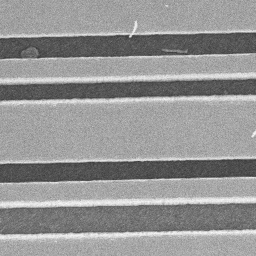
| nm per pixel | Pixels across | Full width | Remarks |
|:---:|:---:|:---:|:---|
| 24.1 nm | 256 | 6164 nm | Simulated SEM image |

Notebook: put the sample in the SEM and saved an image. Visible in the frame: lines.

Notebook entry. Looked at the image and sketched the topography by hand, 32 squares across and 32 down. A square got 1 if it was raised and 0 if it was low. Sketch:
11111111111111111111111111111111
11111111111111111111111111111111
11111111111111111111111111111111
11111111111111111111111111111111
11111111110000000000000000000000
00000000000000000000000000000000
00000000000000000000000000000000
11111111111111111111111111111111
11111111111111111111111111111111
11111111111111111111111111111111
00000000000000000000000000000000
00000000000000000000000000000000
00000001111111111111111111111111
11111111111111111111111111111111
11111111111111111111111111111111
11111111111111111111111111111111
11111111111111111111111111111111
11111111111111111111111111111111
11111111111111111111111111111111
11111111111111111111111111111111
00000000000000000000000000000000
00000000000000000000000000000000
00000000000000011111111111111111
11111111111111111111111111111111
11111111111111111111111111111111
11111111111111110000000000000000
00000000000000000000000000000000
00000000000000000000000000000000
00000000000000000000000000000000
11111111111111111111111111111111
11111111111111111111111111111111
11111111111111111111111111111111